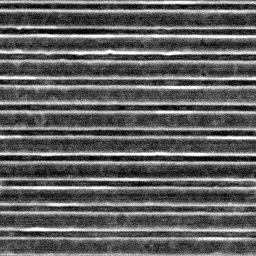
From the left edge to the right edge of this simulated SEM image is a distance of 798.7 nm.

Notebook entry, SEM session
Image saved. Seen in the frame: parallel lines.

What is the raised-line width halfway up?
0.0593 microns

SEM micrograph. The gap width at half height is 19.9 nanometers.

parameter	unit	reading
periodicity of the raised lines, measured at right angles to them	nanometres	78.7